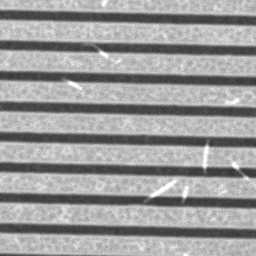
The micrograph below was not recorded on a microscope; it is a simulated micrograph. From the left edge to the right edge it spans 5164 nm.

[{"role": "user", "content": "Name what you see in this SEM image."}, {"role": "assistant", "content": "parallel lines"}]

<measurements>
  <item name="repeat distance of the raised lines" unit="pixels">30.4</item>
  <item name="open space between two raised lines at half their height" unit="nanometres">224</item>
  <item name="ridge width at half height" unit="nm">380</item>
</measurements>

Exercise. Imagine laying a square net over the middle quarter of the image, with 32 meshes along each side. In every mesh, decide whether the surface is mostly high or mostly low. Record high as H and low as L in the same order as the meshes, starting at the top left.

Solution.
HHHHHHHHHHHHHHHHHHHHHHHHHHHHHHHH
HHHHHHHHHHHHHHHHHHHHHHHHHHHHHHHH
LLLLLLLLLLLLLLLLLLLLLLLLLLLLLHHL
LLLLLLLLLLLLLLLLLLLLLLLLLLLLLLLL
LLLLLLLLLLLLLLLLLLLLLLLLLLLLLLLL
HHHHHHHHHHHHHHHHHHHHHHHHHHHHHHHH
HHHHHHHHHHHHHHHHHHHHHHHHHHHHHHHH
HHHHHHHHHHHHHHHHHHHHHHHHHHHHHHHH
HHHHHHHHHHHHHHHHHHHHHHHHHHHHHHHH
LLLLLLHHHHHHHHHHHHHHHHHHHHHHHHHH
LLLLLLLLLLLLLLLLLLLLLLLLLLLLLLLL
LLLLLLLLLLLLLLLLLLLLLLLLLLLLLLLL
LLLHLLLLLLLLLLLLLLLLLLLLLLLLLLLL
HHHHHHHHHHHHHHHHHHHHHHHHHHHHHHHH
HHHHHHHHHHHHHHHHHHHHHHHHHHHHHHHH
HHHHHHHHHHHHHHHHHHHHHHHHHHHHHHHH
HHHHHHHHHHHHHHHHHHHHHHHHHHHHHHHH
LLLLLLLLLLLLLLLLLLLLHHHHHHHHHHHH
LLLLLLLLLLLLLLLLLLLLLLLLLLLLLLLL
LLLLLLLLLLLLLLLLLLLLLLLLLLLLLLLL
HHHHHHHHHHHHHHHHHHHLLLLLLLLLLLLL
HHHHHHHHHHHHHHHHHHHHHHHHHHHHHHHH
HHHHHHHHHHHHHHHHHHHHHHHHHHHHHHHH
HHHHHHHHHHHHHHHHHHHHHHHHHHHHHHHH
HHHHHHHHHHHHHHHHHHHHHHHHHHHHHHHH
LLLLLLLLLLLLLLLLLLLLLLLLLLLLLLLL
LLLLLLLLLLLLLLLLLLLLLLLLLLLLLLLL
LLLLLLLLLLLLLLLLLLLLLLLLLLLLLLLL
HHHHHHHHHHHHHHHHHHHHHHHHHHHHHHHH
HHHHHHHHHHHHHHHHHHHHHHHHHHHHHHHH
HHHHHHHHHHHHHHHHHHHHHHHHHHHHHHHH
HHHHHHHHHHHHHHHHHHHHHHHHHHHHHHHH